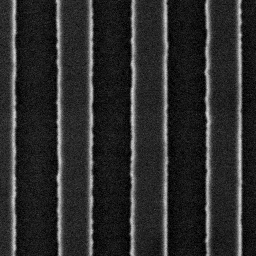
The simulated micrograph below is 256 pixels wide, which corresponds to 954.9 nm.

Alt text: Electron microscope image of lines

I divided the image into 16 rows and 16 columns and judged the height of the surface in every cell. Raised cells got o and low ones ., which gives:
o...oo..oo...oo.
o...oo..oo...oo.
o...oo..oo...oo.
o...oo..oo...oo.
o...oo..oo...oo.
o...oo..oo...oo.
o...oo..oo...oo.
o...oo..oo...oo.
o...oo..oo...oo.
o...oo..oo...oo.
o...oo..oo...oo.
o...oo..oo...oo.
o...oo..oo...oo.
o...oo..oo...oo.
o...oo..oo...oo.
o...oo..oo...oo.